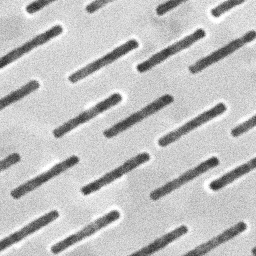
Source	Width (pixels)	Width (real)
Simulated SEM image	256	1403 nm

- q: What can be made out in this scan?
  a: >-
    a regular array of holes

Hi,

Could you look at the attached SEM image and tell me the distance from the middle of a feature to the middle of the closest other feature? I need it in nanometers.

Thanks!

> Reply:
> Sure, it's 310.